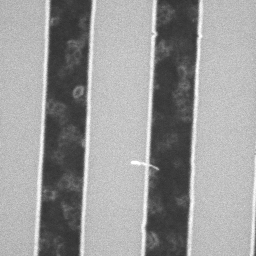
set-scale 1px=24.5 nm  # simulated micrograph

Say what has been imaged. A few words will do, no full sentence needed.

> one or a few lines or trenches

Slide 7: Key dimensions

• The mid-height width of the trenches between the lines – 1480 nanometers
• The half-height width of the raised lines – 1120 nanometers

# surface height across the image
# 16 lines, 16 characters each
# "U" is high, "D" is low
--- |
DDDUUUDDDDUUUDDD
DDDUUUDDDDUUUDDD
DDDUUUDDDDUUDDDD
DDDUUUDDDDUUDDDD
DDDUUUDDDUUUDDDD
DDDUUUDDDUUUDDDD
DDDUUUDDDUUUDDDD
DDDUUUDDDUUUDDDD
DDDUUDDDDUUUDDDD
DDDUUDDDDUUUDDDD
DDDUUDDDDUUUDDDD
DDUUUDDDDUUUDDDD
DDUUUDDDDUUUDDDD
DDUUUDDDDUUUDDDD
DDUUUDDDDUUUDDDD
DDUUUDDDDUUUDDDD